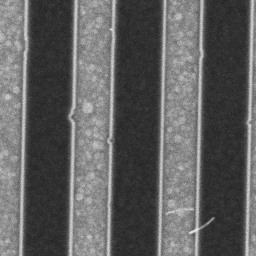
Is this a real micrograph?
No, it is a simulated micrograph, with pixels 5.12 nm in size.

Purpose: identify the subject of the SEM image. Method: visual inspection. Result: one or a few lines or trenches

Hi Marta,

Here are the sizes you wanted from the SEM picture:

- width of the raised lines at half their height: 263 nm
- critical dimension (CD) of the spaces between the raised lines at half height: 36.2 pixels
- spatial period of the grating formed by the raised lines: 87.9 px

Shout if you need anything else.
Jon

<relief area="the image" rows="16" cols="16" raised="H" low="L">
LLHHHLLHHHLLLHHH
LLHHHLLHHHLLLHHH
LLHHHLLHHHLLLHHH
LLHHHLLHHHLLLHHH
LLHHHLLHHHLLLHHH
LLHHHLLHHHLLHHHH
LLHHHLLHHHLLHHHH
LHHHHLLHHHLLHHHH
LHHHHLLHHHLLHHHH
LHHHHLLHHHLLHHHH
LHHHHLLHHHLLHHHH
LHHHHLLHHHLLHHHH
LHHHLLLHHHLLHHHL
LHHHLLLHHHLLHHHL
LHHHLLLHHHLLHHHL
LHHHLLLHHHLLHHHL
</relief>